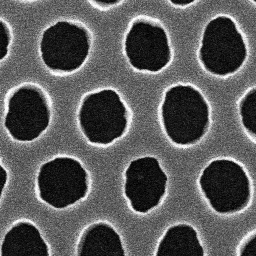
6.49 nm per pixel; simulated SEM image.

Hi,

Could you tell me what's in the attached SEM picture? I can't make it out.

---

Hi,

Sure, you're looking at a regular array of holes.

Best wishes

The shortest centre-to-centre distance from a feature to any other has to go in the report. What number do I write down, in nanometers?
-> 494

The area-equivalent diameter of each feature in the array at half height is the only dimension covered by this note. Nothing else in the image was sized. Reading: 326 nanometres